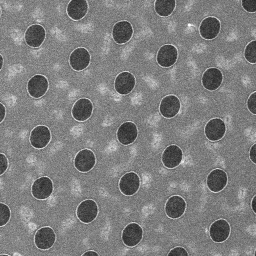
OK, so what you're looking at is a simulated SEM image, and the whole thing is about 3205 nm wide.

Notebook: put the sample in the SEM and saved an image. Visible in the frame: a regular array of raised bodies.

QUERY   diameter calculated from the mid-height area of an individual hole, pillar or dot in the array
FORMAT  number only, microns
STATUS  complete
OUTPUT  0.284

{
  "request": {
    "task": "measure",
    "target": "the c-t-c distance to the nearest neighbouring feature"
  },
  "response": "0.629 microns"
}